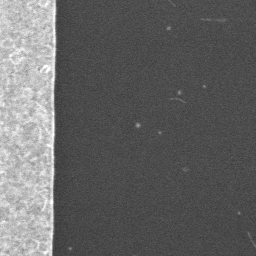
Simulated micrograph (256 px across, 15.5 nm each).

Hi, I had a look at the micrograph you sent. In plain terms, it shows wiring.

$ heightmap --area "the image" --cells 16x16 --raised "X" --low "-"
XXX-------------
XXX-------------
XXX-------------
XXX-------------
XXX-------------
XXX-------------
XXX-------------
XXX-------------
XXX-------------
XXX-------------
XXX-------------
XXX-------------
XXX-------------
XXX-------------
XXX-------------
XXX-------------